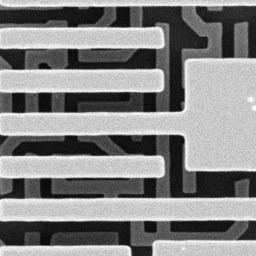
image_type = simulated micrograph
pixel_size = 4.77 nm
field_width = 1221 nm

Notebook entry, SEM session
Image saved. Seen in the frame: wiring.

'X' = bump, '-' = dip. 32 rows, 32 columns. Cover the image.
XXXXXXXXXXXXXXXXXXXXXXXXXXXXXXXX
--------------------------------
--------------------------------
-----------X------XX------------
XXXXXXXXXXXXXXXXXXXX------------
XXXXXXXXXXXXXXXXXXXXX-----------
--------------------------------
-----------------------XXXXXXXXX
-----------------------XXXXXXXXX
XXXXXXXXXXXXXXXXXXXX---XXXXXXXXX
XXXXXXXXXXXXXXXXXXXX---XXXXXXXXX
XXXXXXXXXXXXX----XX----XXXXXXXXX
-----------------------XXXXXXXXX
-----------------------XXXXXXXXX
XXXXXXXXXXXXXXXXXXXXXXXXXXXXXXXX
XXXXXXXXXXXXXXXXXXXXXXXXXXXXXXXX
XXXXXXXXXXXXXXXXXXXXXXXXXXXXXXXX
-----------------------XXXXXXXXX
-----------------------XXXXXXXXX
-----------------------XXXXXXXXX
XXXXXXXXXXXXXXXXXXXXX--XXXXXXXXX
XXXXXXXXXXXXXXXXXXXXX-----------
--------------------------------
--------------------------------
--------------------------------
XXXXXXXXXXXXXXXXXXXXXXXXXXXXXXXX
XXXXXXXXXXXXXXXXXXXXXXXXXXXXXXXX
XXXXXXXXXXXXXXXXXXXXXX-X-X------
--------------------------------
--------------------------------
-------------------XXXXXXXXXXXXX
XXXXXXXXXXXXXXXX---XXXXXXXXXXXXX